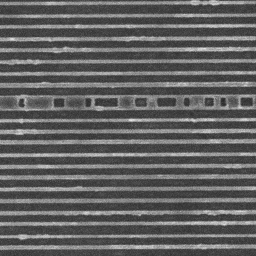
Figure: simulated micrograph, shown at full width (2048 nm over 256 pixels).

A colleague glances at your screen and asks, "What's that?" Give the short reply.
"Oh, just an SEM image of parallel lines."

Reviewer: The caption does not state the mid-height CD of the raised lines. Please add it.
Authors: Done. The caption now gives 29 nm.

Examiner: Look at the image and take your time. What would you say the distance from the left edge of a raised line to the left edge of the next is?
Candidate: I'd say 92.8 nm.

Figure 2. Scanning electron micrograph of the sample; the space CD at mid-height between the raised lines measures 8.12 pixels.